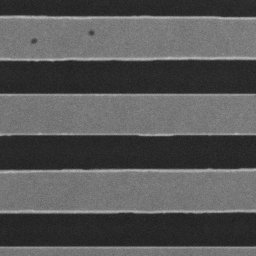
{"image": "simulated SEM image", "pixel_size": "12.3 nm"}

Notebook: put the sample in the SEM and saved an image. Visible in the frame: lines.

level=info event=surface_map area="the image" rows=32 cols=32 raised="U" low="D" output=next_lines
DDDDDDDDDDDDDDDDDDDDDDDDDDDDDDDD
DDDDDDDDDDDDDDDDDDDDDDDDDDDDDDDD
UUUUUUUUUUUUUUUUUUUUUUUUUUUUUUUU
UUUUUUUUUUUUUUUUUUUUUUUUUUUUUUUU
UUUUUUUUUUUUUUUUUUUUUUUUUUUUUUUU
UUUUUUUUUUUUUUUUUUUUUUUUUUUUUUUU
UUUUUUUUUUUUUUUUUUUUUUUUUUUUUUUU
UUUUUUUUUUUUUDDUUUUDDDDDDDDDDDDD
DDDDDDDDDDDDDDDDDDDDDDDDDDDDDDDD
DDDDDDDDDDDDDDDDDDDDDDDDDDDDDDDD
DDDDDDDDDDDDDDDDDDDDDDDDDDDDDDDD
DDDDDDDDDDDDDDDDDDDDDDDDDDDDDDDD
UUUUUUUUUUUUUUUUUUUUUUUUUUUUUUUU
UUUUUUUUUUUUUUUUUUUUUUUUUUUUUUUU
UUUUUUUUUUUUUUUUUUUUUUUUUUUUUUUU
UUUUUUUUUUUUUUUUUUUUUUUUUUUUUUUU
UUUUUUUUUUUUUUUUUUUUUUUUUUUUUUUU
DDDDDDDDDDDDDDDDDDDDDDDDDDDDDDDD
DDDDDDDDDDDDDDDDDDDDDDDDDDDDDDDD
DDDDDDDDDDDDDDDDDDDDDDDDDDDDDDDD
DDDDDDDDDDDDDDDDDDDDDDDDDDDDDDDD
UUUUUUUUUUUUUUUUUUUUUUUUUUUUUUUU
UUUUUUUUUUUUUUUUUUUUUUUUUUUUUUUU
UUUUUUUUUUUUUUUUUUUUUUUUUUUUUUUU
UUUUUUUUUUUUUUUUUUUUUUUUUUUUUUUU
UUUUUUUUUUUUUUUUUUUUUUUUUUUUUUUU
UUUUUUUUUUUUUUUUUUUUUUUUUUUUUDDU
DDDDDDDDDDDDDDDDDDDDDDDDDDDDDDDD
DDDDDDDDDDDDDDDDDDDDDDDDDDDDDDDD
DDDDDDDDDDDDDDDDDDDDDDDDDDDDDDDD
DDDDDDDDDDDDDDDDDDDDDDDDDDDDDDDD
UUUUUUUUUUUUUUUUUUUUUUUUUUUUUUUU